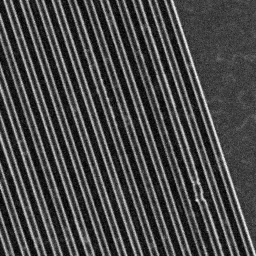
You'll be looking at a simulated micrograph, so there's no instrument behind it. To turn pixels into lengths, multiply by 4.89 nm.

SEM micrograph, parallel lines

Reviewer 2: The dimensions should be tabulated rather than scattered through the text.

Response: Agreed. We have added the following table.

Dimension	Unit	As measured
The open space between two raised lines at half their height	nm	38.3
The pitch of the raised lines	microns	0.0747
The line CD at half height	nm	33.7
